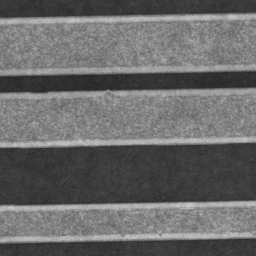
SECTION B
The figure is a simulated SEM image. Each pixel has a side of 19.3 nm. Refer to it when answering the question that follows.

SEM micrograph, one or a few lines or trenches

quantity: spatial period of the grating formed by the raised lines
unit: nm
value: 1710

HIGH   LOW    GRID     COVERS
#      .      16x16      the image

................
################
################
################
#...............
................
################
################
################
................
................
................
................
################
################
................